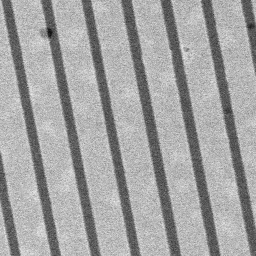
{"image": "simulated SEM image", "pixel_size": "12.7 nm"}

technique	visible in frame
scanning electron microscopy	parallel lines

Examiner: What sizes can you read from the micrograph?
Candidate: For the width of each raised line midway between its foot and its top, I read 0.354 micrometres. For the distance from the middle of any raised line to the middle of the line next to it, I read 498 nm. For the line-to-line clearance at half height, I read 148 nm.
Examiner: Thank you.